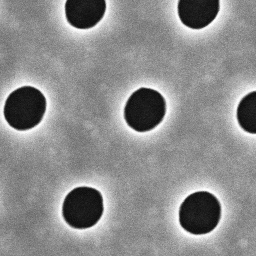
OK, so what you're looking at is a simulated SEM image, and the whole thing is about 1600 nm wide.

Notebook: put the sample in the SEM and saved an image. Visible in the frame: holes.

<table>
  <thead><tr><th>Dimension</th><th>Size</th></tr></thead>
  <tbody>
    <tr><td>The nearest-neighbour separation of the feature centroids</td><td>722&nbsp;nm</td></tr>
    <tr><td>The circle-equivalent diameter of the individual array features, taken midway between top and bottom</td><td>271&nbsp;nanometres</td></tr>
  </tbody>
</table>